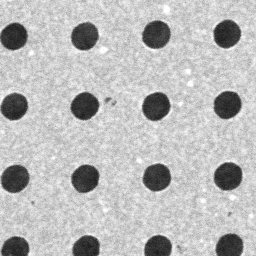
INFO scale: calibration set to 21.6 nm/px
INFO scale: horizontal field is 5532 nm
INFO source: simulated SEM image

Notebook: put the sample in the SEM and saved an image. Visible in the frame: a regular array of holes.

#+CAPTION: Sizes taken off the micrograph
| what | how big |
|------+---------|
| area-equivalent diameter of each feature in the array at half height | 638 nanometers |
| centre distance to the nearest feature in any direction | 1530 nm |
